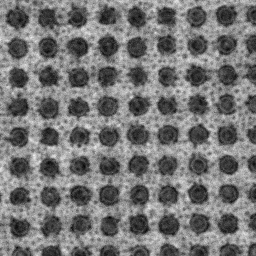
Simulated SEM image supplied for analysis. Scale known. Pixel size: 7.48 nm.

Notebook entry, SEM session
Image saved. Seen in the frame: a regular array of raised bodies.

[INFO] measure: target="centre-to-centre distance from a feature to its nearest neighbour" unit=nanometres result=218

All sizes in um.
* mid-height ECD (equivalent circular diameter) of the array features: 0.109